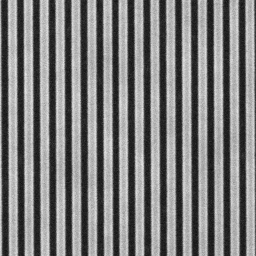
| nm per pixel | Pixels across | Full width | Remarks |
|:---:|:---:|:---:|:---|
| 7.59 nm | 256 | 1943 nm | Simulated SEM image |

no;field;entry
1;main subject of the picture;parallel lines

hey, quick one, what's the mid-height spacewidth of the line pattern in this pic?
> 57 nm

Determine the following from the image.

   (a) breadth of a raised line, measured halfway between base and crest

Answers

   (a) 63.6 nm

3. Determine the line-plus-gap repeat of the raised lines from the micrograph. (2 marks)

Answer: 120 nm